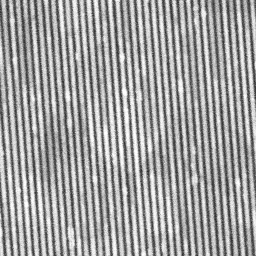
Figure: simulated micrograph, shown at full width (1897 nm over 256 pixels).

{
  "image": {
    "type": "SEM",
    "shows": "parallel lines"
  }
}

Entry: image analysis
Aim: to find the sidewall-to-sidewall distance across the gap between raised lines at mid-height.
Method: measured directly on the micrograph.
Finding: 24.9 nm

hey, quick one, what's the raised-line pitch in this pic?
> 52.5 nanometers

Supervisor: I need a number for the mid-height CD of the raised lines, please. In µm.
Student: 0.0249